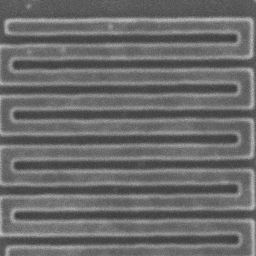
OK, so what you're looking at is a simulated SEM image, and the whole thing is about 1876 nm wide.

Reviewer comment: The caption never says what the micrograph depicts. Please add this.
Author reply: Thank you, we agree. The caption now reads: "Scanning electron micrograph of groups of lines, slits or small figures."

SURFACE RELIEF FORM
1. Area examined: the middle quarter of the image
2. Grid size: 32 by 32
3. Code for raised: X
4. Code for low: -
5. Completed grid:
--------------------------------
--------------------------------
XXXXXXXXXXXXXXXXXXXXXXXXXXXXXXXX
XXXXXXXXXXXXXXXXXXXXXXXXXXXXXXXX
XXXXXXXXXXXXXXXXXXXXXXXXXXXXXXXX
--------------------------------
--------------------------------
--------------------------------
XXXXXXXXXXXXXXXXXXXXXXXXXXXXXXXX
XXXXXXXXXXXXXXXXXXXXXXXXXXXXXXXX
XXXXXXXXXXXXXXXXXXXXXXXXXXXXXXXX
--------------------------------
--------------------------------
--------------------------------
XXXXXXXXXXXXXXXXXXXXXXXXXXXXXXXX
XXXXXXXXXXXXXXXXXXXXXXXXXXXXXXXX
XXXXXXXXXXXXXXXXXXXXXXXXXXXXXXXX
XXX-----------------------------
--------------------------------
--------------------------------
------------------XXXXX--XXXXXXX
XXXXXXXXXXXXXXXXXXXXXXXXXXXXXXXX
XXXXXXXXXXXXXXXXXXXXXXXXXXXXXXXX
XXXXXXXXXXXXXXXXXXXXXXXXXXXXXXXX
--------------------------------
--------------------------------
--------------------------------
XXXXXXXXXXXXXXXXXXXXXXXXXXXXXXXX
XXXXXXXXXXXXXXXXXXXXXXXXXXXXXXXX
XXXXXXXXXXXXXXXXXXXXXXXXXXXXXXXX
--------------------------------
--------------------------------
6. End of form